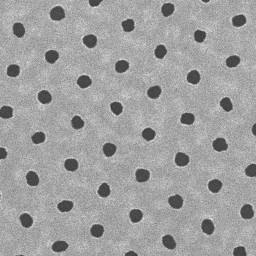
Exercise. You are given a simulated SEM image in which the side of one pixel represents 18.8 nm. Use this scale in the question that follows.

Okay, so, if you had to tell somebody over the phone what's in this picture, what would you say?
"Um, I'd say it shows a regular array of holes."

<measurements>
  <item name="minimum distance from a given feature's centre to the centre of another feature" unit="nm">768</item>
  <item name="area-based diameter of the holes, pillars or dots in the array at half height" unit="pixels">13.7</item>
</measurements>